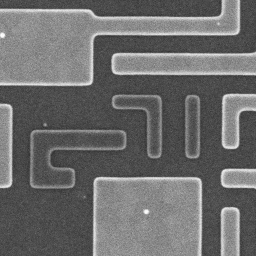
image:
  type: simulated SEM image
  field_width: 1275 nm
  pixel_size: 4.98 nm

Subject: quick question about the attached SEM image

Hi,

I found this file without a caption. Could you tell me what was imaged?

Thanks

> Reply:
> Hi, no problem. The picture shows wiring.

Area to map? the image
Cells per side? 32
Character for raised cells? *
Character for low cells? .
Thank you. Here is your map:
............................**..
***********.................**..
******************************..
******************************..
************....................
************....................
************....................
************..******************
************..******************
************....................
***********.....................
................................
..............******...**...****
*..............*****...**...****
*.................**...**...**..
*.................**...**...**..
*...***********...**...**...**..
*...************..**...**...**..
*...***********...**...**...*...
*...**.............*....*.......
*...**..........................
*...*****...................****
*...*****...*************...****
.....***....*************......*
............*************.......
............*************.......
............*************...**..
............*************...**..
............*************...**..
............*************...**..
............*************...**..
............*************...**..